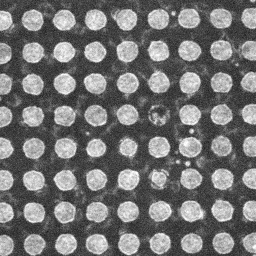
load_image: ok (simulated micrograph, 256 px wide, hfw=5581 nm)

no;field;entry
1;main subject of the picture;a regular array of raised bodies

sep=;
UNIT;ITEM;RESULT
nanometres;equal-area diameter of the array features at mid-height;439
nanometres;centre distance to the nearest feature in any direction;681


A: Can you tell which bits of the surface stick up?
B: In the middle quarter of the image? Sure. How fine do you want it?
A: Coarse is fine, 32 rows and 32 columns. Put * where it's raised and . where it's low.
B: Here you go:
................................
................................
.......*.......**......**.....**
**....****....****....****...***
***..*****...*****...*****...***
***..*****....****...*****...***
**....****....****....****....**
................................
................................
................................
...............**.............**
**....****....****...........***
***..******..*****...........***
***...*****...****...........***
**....****....****............**
................................
................................
................................
.......................**......*
**.....**......***....****...***
***...****....****...*****...***
***...****....****...*****...***
**....****.....**.....****....**
*...............................
................................
................................
........*......................*
**....****....****....***.....**
***...****....*****...***....***
***...****....****....***....***
***...****....****..........*.**
................................